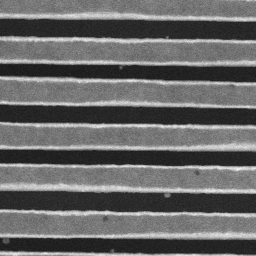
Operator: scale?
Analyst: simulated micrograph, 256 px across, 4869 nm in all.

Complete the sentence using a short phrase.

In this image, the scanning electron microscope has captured lines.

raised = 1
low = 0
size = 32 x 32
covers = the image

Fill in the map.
11111111111111111111111111111111
11111111111111111111111111111111
00000000000000000000111111111111
00000000000000000000000000000000
00000000000000000000000000000000
11111111111111111111111111111111
11111111111111111111111111111111
11111111111111111111111111111111
00000000000000000000000000000000
00000000000000000000000000000000
11111111111111111111111111111111
11111111111111111111111111111111
11111111111111111111111111111111
00000000000000000000000000000000
00000000000000000000000000000000
11111111110000000000000000000000
11111111111111111111111111111111
11111111111111111111111111111111
11111111111111111111111111111111
00000000000000000000000000000000
11110000000000000000000000000000
11111111111111111111111111111111
11111111111111111111111111111111
11111111111111111111111111111111
00000000000000000000000000000000
00000000000000000000000000000000
11111111111111100010000000000000
11111111111111111111111111111111
11111111111111111111111111111111
11111111111111111111111111111111
00000000000000000000000000000000
10000000000000000000000000000000